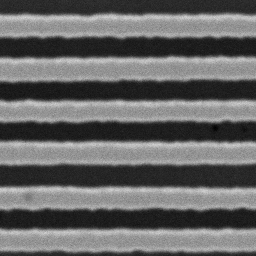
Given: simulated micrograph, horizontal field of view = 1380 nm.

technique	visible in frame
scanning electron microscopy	lines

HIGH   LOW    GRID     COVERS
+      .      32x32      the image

................................
................................
++++++++++++++++++++++++++++++++
++++++++++++++++++++++++++++++++
++++++++++++++++++++++++++++++++
................................
................................
++++++++++++++++++++++++++++++++
++++++++++++++++++++++++++++++++
++++++++++++++++++++++++++++++++
................................
................................
...+............................
++++++++++++++++++++++++++++++++
++++++++++++++++++++++++++++++++
................................
................................
................................
++++++++++++++++++++++++++++++++
++++++++++++++++++++++++++++++++
.++..++.......+.+.....+.........
................................
................................
++++++++++..+++++++++++..+......
++++++++++++++++++++++++++++++++
++++++++++++++++++++++++++++++++
................................
................................
................................
++++++++++++++++++++++++++++++++
++++++++++++++++++++++++++++++++
................................